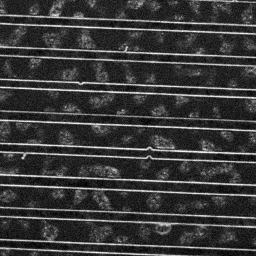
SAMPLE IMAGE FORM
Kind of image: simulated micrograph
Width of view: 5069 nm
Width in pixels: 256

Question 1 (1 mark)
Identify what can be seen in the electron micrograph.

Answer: parallel lines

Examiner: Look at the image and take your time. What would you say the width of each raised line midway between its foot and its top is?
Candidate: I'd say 171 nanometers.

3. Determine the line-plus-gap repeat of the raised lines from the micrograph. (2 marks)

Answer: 0.635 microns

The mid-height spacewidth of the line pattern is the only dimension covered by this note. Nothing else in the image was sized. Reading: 23.2 pixels